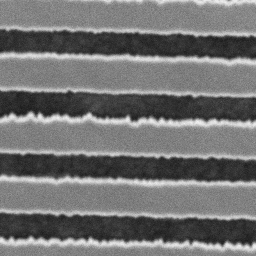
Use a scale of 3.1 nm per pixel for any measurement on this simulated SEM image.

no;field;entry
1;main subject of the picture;lines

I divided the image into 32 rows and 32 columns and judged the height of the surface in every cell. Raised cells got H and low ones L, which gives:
HHHHHHHHHHHHHHHHHHHHHHHHHHHHHHHH
HHHHHHHHHHHHHHHHHHHHHHHHHHHHHHHH
HHHHHHHHHHHHHHHHHHHHHHHHHHHHHHHH
HHHHHHHHHHHHHHHHHHHHHHHHHHHHHHHH
LLLLLLLLLLLLLLLLLLLLLLLLLLLLLLLL
LLLLLLLLLLLLLLLLLLLLLLLLLLLLLLLL
LLLLLLLLLLLLLLLLLLLLLLLLLLLLLLLL
HHHHHHHHHHHHHHHHHHHHHHHHHHHHHHHH
HHHHHHHHHHHHHHHHHHHHHHHHHHHHHHHH
HHHHHHHHHHHHHHHHHHHHHHHHHHHHHHHH
HHHHHHHHHHHHHHHHHHHHHHHHHHHHHHHH
LLLLLLLHLLLHHHHHHHHHHHHHHHHHHHHH
LLLLLLLLLLLLLLLLLLLLLLLLLLLLLLLL
LLLLLLLLLLLLLLLLLLLLLLLLLLLLLLLL
LHLHHLHHHLLHLLLLLLLLLLLLLLLLLLLL
HHHHHHHHHHHHHHHHHHHHHHHHHHHHHHHH
HHHHHHHHHHHHHHHHHHHHHHHHHHHHHHHH
HHHHHHHHHHHHHHHHHHHHHHHHHHHHHHHH
HHHHHHHHHHHHHHHHHHHHHHHHHHHHHHHH
LLLLLLLLLLLLLLHLHHHHHHHHHHHHHHHH
LLLLLLLLLLLLLLLLLLLLLLLLLLLLLLLL
LLLLLLLLLLLLLLLLLLLLLLLLLLLLLLLL
HHHHHHHHHHHHHHHHHHHLHLHLLLLLLLLL
HHHHHHHHHHHHHHHHHHHHHHHHHHHHHHHH
HHHHHHHHHHHHHHHHHHHHHHHHHHHHHHHH
HHHHHHHHHHHHHHHHHHHHHHHHHHHHHHHH
HHHHHHHHHHHHHHHHHHHHHHHHHHHHHHHH
LLLLLLLLLLLLLLLLLLLLLLLLLLLLLLLL
LLLLLLLLLLLLLLLLLLLLLLLLLLLLLLLL
LLLLLLLLLLLLLLLLLLLLLLLLLLLLLLLL
HHHHHHHHHHHHHHHHHHHHHHHHHHHLHLLL
HHHHHHHHHHHHHHHHHHHHHHHHHHHHHHHH